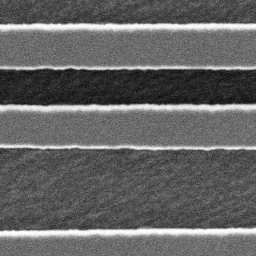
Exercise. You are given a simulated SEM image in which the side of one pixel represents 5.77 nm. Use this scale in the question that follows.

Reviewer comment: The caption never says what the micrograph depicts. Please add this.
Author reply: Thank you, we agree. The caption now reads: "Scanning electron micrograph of lines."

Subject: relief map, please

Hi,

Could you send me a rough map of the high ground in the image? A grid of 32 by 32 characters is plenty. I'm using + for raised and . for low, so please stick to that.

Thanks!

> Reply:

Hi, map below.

................................
................................
................................
++++++++++++++++++++++++++++++++
++++++++++++++++++++++++++++++++
++++++++++++++++++++++++++++++++
++++++++++++++++++++++++++++++++
++++++++++++++++++++++++++++++++
++++++++++++++++++++++++++++++++
................................
................................
................................
................................
++++++++++++++++++++++++++++++++
++++++++++++++++++++++++++++++++
++++++++++++++++++++++++++++++++
++++++++++++++++++++++++++++++++
++++++++++++++++++++++++++++++++
.....+...........++++++++++.++++
................................
................................
................................
................................
................................
................................
................................
................................
................................
................................
++++++++++++++++++++++++++++++++
++++++++++++++++++++++++++++++++
++++++++++++++++++++++++++++++++